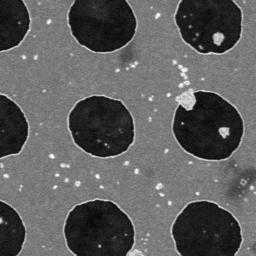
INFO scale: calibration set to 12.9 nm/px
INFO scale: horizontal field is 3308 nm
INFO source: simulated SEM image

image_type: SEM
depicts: holes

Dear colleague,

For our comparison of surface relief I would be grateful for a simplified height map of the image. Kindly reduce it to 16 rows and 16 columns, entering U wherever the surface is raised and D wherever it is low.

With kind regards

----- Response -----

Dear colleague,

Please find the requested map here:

DDUUDDDDUUUDDDDU
DDUUDDDDUUUDDDDU
DUUUUDDDUUUUDDDU
UUUUUUUUUUUUUUUU
UUUUUUUUUUUUUUUU
UUUUUUUUUUUUUUUU
DUUUUDDDUUUUDDUU
DDUUDDDDUUUDDDDU
DDUUDDDDUUUDDDDU
DUUUUDDDUUUUDDDU
UUUUUUUUUUUUUUUU
UUUUUUUUUUUUUUUU
UUUUUUUUUUUUUUUU
DUUUDDDDUUUDDDDU
DDUUDDDDUUUDDDDU
DUUUDDDDUUUDDDDU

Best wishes